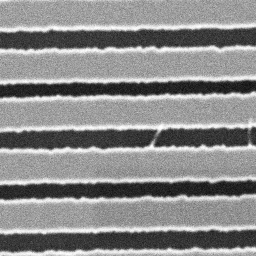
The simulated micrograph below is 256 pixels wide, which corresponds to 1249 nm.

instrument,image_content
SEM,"lines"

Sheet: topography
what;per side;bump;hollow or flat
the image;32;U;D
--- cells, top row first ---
UUUUUUUUUUUUUUUUUUUUUUUUUUUUUUUU
UUUUUUUUUUUUUUUUUUUUUUUUUUUUUUUU
UUUUUUUUUUUUUUUUUUUUUUUUUUUUUUUU
UUUUUUUUUUUUUUUUUUUUUUUUUDDDUDDD
DDDDDDDDDDDDDDDDDDDDDDDDDDDDDDDD
DDDDDDDDDDDDDDDDDDDDDDDDDDDDDDDD
UUUUUUUUUUUUUUUUUUUUUUUUUUUUUUUU
UUUUUUUUUUUUUUUUUUUUUUUUUUUUUUUU
UUUUUUUUUUUUUUUUUUUUUUUUUUUUUUUU
UUUUUUUUUUUUUUUUUUUUUUUUUUUUUUUU
UUDDDDDDDDDDDDDDDDDDDDDDDDDDDDDD
DDDDDDDDDDDDDDDDDDDDDDDDDDDDDDDD
UUUUUUUUUUUUUUUUUUUUUUUUUUUUUUUU
UUUUUUUUUUUUUUUUUUUUUUUUUUUUUUUU
UUUUUUUUUUUUUUUUUUUUUUUUUUUUUUUU
UUUUUUUUUUUUUUUUUUUUUUUUUUUUUUUU
DDDDDDDDDDDDDDDDDDDDDDDDDDDDDDDD
DDDDDDDDDDDDDDDDDDDDDDDDDDDDDDDD
DDDDDDDDDDDUDDDDDDUUUUUUUUUUUUUU
UUUUUUUUUUUUUUUUUUUUUUUUUUUUUUUU
UUUUUUUUUUUUUUUUUUUUUUUUUUUUUUUU
UUUUUUUUUUUUUUUUUUUUUUUUUUUUUUUU
UUUUUUUUUUUUUUUUUUUUUUUUUUUUUUUD
DDDDDDDDDDDDDDDDDDDDDDDDDDDDDDDD
DDDDDDDDDDDDDDDDDDDDDDUDDDDUDDUU
UUUUUUUUUUUUUUUUUUUUUUUUUUUUUUUU
UUUUUUUUUUUUUUUUUUUUUUUUUUUUUUUU
UUUUUUUUUUUUUUUUUUUUUUUUUUUUUUUU
UUUUUUUUUUUUUUUUUUUUUUUUUUUUUUUU
DDDDDDDDDDDDDDDDDDDDDDDDDDDDDDDD
DDDDDDDDDDDDDDDDDDDDDDDDDDDDDDDD
DDDUDDUUDUUUUUUUUUUUUUUUUUUUUUUU